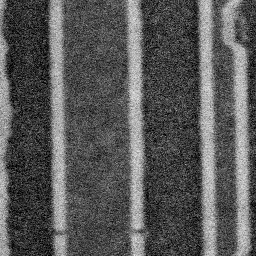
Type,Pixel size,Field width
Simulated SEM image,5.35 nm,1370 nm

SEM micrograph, one or a few lines or trenches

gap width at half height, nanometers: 384